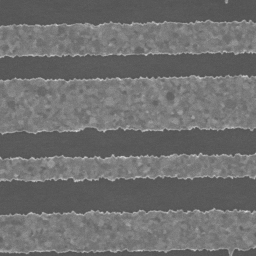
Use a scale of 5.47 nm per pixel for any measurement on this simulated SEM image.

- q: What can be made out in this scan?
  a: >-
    one or a few lines or trenches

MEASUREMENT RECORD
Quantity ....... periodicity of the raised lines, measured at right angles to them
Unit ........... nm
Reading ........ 352